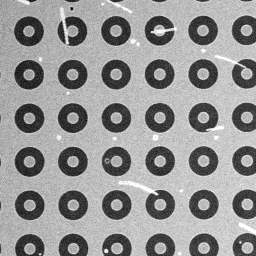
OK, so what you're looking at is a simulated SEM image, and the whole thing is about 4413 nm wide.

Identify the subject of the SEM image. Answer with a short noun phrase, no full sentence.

an array of small figures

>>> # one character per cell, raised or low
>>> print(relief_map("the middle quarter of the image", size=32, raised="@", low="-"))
-----@@@@@------@@@@@------@@@@@
--@---@@@---@@---@@@---@@---@@@-
-@@---@@@---@@---@@@---@@---@@@-
-@@---@@@---@@---@@@---@@---@@@-
------@@@@------@@@@@------@@@@-
-----@@@@@@-----@@@@@-----@@@@@@
@@@@@@@@@@@@-@@@@@@@@@@@@@@@@@@@
@@@@@@@@@@@@@@@@@@@@@@@@@@@@@@@@
@@@@@@@@@@@@@@@@@@@@@@@@@@@@@@@@
@@@@@@@@@@@@@@@@@@@@@@@@@@@@@@@@
-----@@@@@@----@@@@@@@----@@@@@@
-----@@@@@------@@@@@------@@@@@
-@@---@@@@--@@---@@@---@@---@@@-
-@@---@@@---@@---@@@---@@---@@@-
-@@---@@@---@@---@@@---@@---@@@-
------@@@@------@@@@@------@@@@@
-----@@@@@@----@@@@@@@----@@@@@@
@@@@@@@@@@@@@@@@@@@@@@@@@@@@@@@@
@@@@@@@@@@@@@@@@@@@@@@@@@@@@@@@@
@@@@@@@@@@@@@@@@@@@@@@@@@@@@@@@@
@@@@@@@@@@@@@@@@@@@@@@@@@@@@@@@@
-----@@@@@@-----@@@@@------@@@@@
------@@@@------@@@@@------@@@@@
-@@---@@@---@@---@@@---@@---@@@-
-@@---@@@---@@---@@@---@@---@@@-
--@---@@@@--@@---@@@--------@@@-
-----@@@@@------@@@@@------@@@@@
----@@@@@@@----@@@@@@@----@@@@@@
@@@@@@@@@@@@@@@@@@@@@@@@@@@@@@@@
@@@@@@@@@@@@@@@@@@@@@@@@@@@@@@@@
@@@@@@@@@@@@@@@@@@@@@@@@@@@@@@@@
@@-@@@@@@@@@--@@@@@@@@@--@@@@@@@